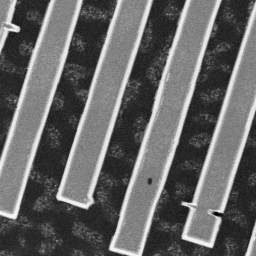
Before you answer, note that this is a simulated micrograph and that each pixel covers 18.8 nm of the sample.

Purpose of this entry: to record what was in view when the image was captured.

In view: one or a few lines or trenches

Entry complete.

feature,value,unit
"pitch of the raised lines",65.5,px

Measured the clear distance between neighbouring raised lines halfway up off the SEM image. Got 678 nanometers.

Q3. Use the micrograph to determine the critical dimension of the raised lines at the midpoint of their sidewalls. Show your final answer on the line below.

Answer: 553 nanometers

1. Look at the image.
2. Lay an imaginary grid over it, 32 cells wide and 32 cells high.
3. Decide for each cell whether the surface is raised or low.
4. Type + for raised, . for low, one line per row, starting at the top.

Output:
++....++++.....++++....++++.....
+.....++++.....+++.....++++.....
+.....+++.....++++.....++++....+
++...++++.....++++....++++.....+
+....++++.....++++....++++.....+
.....++++....++++.....++++....++
....++++.....++++....++++.....++
....++++.....+++.....++++.....++
....++++....++++.....++++.....++
...++++.....++++....++++.....+++
...++++.....++++....++++.....+++
...++++....++++.....++++.....+++
...+++.....++++.....++++....++++
..++++.....++++....++++.....++++
..++++....++++.....++++.....++++
..+++.....++++.....++++....++++.
.++++.....++++....++++.....++++.
.++++....++++.....++++.....++++.
.+++.....++++.....++++....++++..
++++.....++++.....+++.....++++..
++++....+++++....++++.....++++..
+++.....++++.....++++....++++...
+++.....++++.....+++.....++++...
+++.....++++....++++.....++++...
+++....++++.....++++.....+++....
++........+.....+++.....++++....
++.............++++.....+++.....
...............++++.....+++.....
...............+++.....++++.....
...............+++.....++++.....
..............++++.............+
...............+++.............+